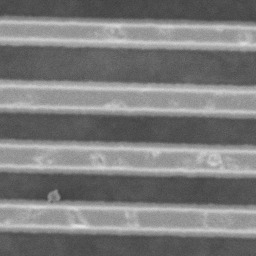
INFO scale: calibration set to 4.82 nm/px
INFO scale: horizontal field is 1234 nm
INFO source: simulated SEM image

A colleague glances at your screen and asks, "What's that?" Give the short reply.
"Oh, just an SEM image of parallel lines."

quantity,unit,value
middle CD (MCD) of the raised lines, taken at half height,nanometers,124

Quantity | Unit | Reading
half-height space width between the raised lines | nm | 166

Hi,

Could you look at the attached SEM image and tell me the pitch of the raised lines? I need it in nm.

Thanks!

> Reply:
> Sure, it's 298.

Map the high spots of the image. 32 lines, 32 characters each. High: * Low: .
................................
................................
****..*.........................
********************************
********************************
...........***.*****************
................................
................................
................................
................................
****............................
********************************
********************************
********************************
................................
................................
................................
................................
***************************.....
********************************
********************************
................****************
................................
................................
................................
*****..*........................
********************************
********************************
********************************
................................
................................
................................